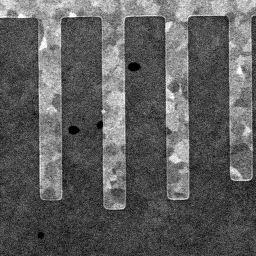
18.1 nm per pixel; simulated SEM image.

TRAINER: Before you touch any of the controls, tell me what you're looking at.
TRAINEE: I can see groups of lines, slits or small figures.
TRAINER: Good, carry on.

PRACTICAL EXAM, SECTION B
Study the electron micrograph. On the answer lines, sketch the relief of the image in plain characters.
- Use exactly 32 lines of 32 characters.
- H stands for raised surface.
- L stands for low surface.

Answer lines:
HHHHHHHHHHHHHHHHHHHHHHHHHHHHHHHH
HHHHHHHHHHHHHHHHHHHHHHHHHHHHHHHH
LLLLLHHHLLLLLHHHLLLLLHHLLLLLLHHL
LLLLLHHHLLLLLHHLLLLLLHHLLLLLLHHL
LLLLLHHHLLLLLHHLLLLLLHHLLLLLLHHL
LLLLLHHHLLLLLHHLLLLLLHHLLLLLLHHL
LLLLLHHHLLLLLHHLLLLLLHHLLLLLLHHL
LLLLLHHHLLLLLHHLLLLLLHHLLLLLLHHL
LLLLLHHHLLLLLHHLLLLLLHHLLLLLLHHL
LLLLLHHHLLLLLHHLLLLLLHHLLLLLLHHL
LLLLLHHHLLLLLHHLLLLLLHHLLLLLLHHL
LLLLLHHHLLLLLHHLLLLLLHHLLLLLLHHL
LLLLLHHHLLLLLHHLLLLLLHHLLLLLLHHL
LLLLLHHHLLLLLHHHLLLLLHHLLLLLLHHL
LLLLLHHHLLLLLHHHLLLLLHHLLLLLLHHL
LLLLLHHHLLLLLHHHLLLLLHHLLLLLLHHL
LLLLLHHHLLLLLHHHLLLLLHHLLLLLLHHL
LLLLLHHHLLLLLHHHLLLLLHHLLLLLLHHL
LLLLLHHHLLLLLHHHLLLLLHHLLLLLLHHL
LLLLLHHHLLLLLHHHLLLLLHHLLLLLLHHL
LLLLLHHHLLLLLHHHLLLLLHHHLLLLLHHL
LLLLLHHHLLLLLHHHLLLLLHHHLLLLLHHL
LLLLLHHHLLLLLHHHLLLLLHHHLLLLLHHL
LLLLLHHHLLLLLHHHLLLLLHHHLLLLLLLL
LLLLLHHHLLLLLHHHLLLLLHHLLLLLLLLL
LLLLLLLLLLLLLHHHLLLLLLLLLLLLLLLL
LLLLLLLLLLLLLLLLLLLLLLLLLLLLLLLL
LLLLLLLLLLLLLLLLLLLLLLLLLLLLLLLL
LLLLLLLLLLLLLLLLLLLLLLLLLLLLLLLL
LLLLLLLLLLLLLLLLLLLLLLLLLLLLLLLL
LLLLLLLLLLLLLLLLLLLLLLLLLLLLLLLL
LLLLLLLLLLLLLLLLLLLLLLLLLLLLLLLL